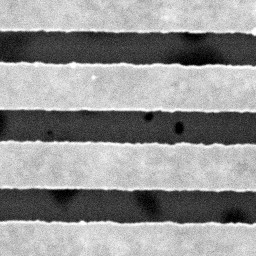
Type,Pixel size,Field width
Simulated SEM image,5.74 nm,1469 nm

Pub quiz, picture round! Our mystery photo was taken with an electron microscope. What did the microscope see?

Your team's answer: lines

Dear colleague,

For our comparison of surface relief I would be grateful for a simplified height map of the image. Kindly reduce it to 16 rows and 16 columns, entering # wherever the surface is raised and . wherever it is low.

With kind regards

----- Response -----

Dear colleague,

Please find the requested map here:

################
################
................
................
################
################
################
................
................
################
################
################
................
................
################
################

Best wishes